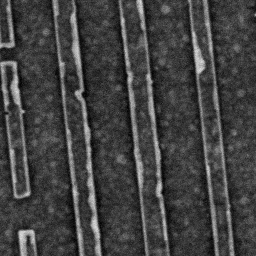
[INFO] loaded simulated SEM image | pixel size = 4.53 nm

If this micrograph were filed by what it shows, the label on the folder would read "one or a few lines or trenches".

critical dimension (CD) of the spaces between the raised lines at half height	207	nanometres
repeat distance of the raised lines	298	nanometers